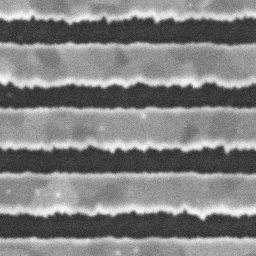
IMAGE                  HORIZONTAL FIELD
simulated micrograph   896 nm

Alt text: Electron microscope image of lines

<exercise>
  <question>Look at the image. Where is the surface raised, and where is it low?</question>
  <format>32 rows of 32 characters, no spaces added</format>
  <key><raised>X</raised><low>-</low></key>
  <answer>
XXXXXXXXXXXXXXXXXXXXXXXXXXXXXXXX
XXXXXXXXXXXXXXXXXXXXXXXXXXXXXXXX
--------XX----------------------
--------------------------------
--------------------------------
XX------X--X--X--XX----XXXX-----
XXXXXXXXXXXXXXXXXXXXXXXXXXXXXXXX
XXXXXXXXXXXXXXXXXXXXXXXXXXXXXXXX
XXXXXXXXXXXXXXXXXXXXXXXXXXXXXXXX
XXXXXXXXXXXXXXXXXXXXXXXXXXXXXXXX
--XXXXXX--XXXX-XX--XXXX-X--XXXX-
--------------------------------
--------------------------------
-------------------------X-X----
XXXXXXXXXXXXXXXXXXXXXXXXXXXXXXXX
XXXXXXXXXXXXXXXXXXXXXXXXXXXXXXXX
XXXXXXXXXXXXXXXXXXXXXXXXXXXXXXXX
XXXXXXXXXXXXXXXXXXXXXXXXXXXXXXXX
----XXX------X-X-X--X--X----X---
--------------------------------
--------------------------------
--------------------------------
XXXXXXXXXXXXXXXXXXXXXXXXXXXXXXXX
XXXXXXXXXXXXXXXXXXXXXXXXXXXXXXXX
XXXXXXXXXXXXXXXXXXXXXXXXXXXXXXXX
XXXXXXXXXXXXXXXXXXXXXXXXXXXXXXXX
XXXXXXX-XXXX-XX--X---XX-XXXXXXXX
--------------------------------
--------------------------------
--------------------------------
XXXXXXXXXXXXXXXXXXXXXXXXXXXXXXXX
XXXXXXXXXXXXXXXXXXXXXXXXXXXXXXXX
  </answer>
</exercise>